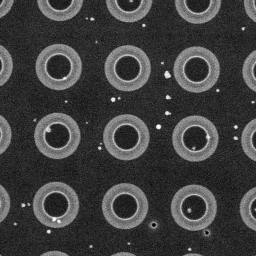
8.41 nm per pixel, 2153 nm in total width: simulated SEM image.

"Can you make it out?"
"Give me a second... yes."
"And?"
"an array of small figures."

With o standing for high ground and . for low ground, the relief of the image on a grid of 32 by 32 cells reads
oo...ooooo...oooooo...oooooo...o
o....ooooo....ooooo...ooooo....o
.......o.......oo......ooo......
................................
................................
................................
o....oooo.....oooo.....ooo......
o....ooooo...oooooo...ooooo....o
oo...ooooo...oooooo...ooooo...oo
o....ooooo...oooooo...ooooo...oo
.....oooo.....oooo....ooooo....o
........................o.......
................................
................................
......ooo......oo.......o.......
o....ooooo...ooooo....ooooo....o
o...oooooo...oooooo...ooooo...oo
o...oooooo...oooooo...ooooo...oo
o....ooooo...ooooo....ooooo...oo
......ooo.....ooo......ooo.....o
................................
................................
................................
.....oooo.....ooo......ooo......
o...oooooo...ooooo....ooooo....o
o...oooooo...ooooo...oooooo...oo
o...oooooo...ooooo...oooooo...oo
.....oooo....ooooo....ooooo...oo
......o........o.......ooo.....o
................................
................................
......oo........................